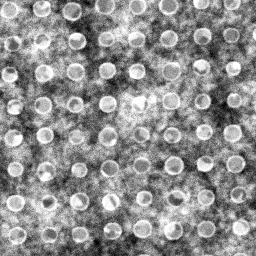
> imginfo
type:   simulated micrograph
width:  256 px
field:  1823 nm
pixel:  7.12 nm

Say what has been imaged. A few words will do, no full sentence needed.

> a regular array of raised bodies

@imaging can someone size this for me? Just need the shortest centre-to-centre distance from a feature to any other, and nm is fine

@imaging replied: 217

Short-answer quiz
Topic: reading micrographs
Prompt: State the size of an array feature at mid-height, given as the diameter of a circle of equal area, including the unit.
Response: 113 nm